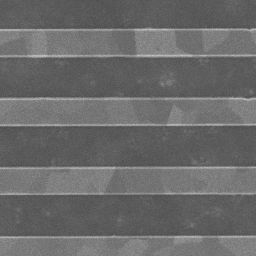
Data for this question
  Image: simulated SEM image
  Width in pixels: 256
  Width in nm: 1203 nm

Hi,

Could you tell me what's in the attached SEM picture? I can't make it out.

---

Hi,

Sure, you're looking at one or a few lines or trenches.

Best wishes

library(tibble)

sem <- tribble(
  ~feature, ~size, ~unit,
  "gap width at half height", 201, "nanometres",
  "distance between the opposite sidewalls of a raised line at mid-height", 0.125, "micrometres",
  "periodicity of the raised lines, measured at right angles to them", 325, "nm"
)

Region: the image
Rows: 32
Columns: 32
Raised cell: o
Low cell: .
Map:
................................
................................
................................
................................
oooooooooooooooooooooooooooooooo
oooooooooooooooooooooooooooooooo
oooooooooooooooooooooooooooooooo
................................
................................
................................
................................
................................
oooooooooooooooooooooooooooooooo
oooooooooooooooooooooooooooooooo
oooooooooooooooooooooooooooooooo
oooooooooooooooooooooooooooooooo
................................
................................
................................
................................
................................
oooooooooooooooooooooooooooooooo
oooooooooooooooooooooooooooooooo
oooooooooooooooooooooooooooooooo
................................
................................
................................
................................
................................
................................
oooooooooooooooooooooooooooooooo
oooooooooooooooooooooooooooooooo